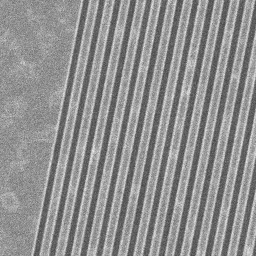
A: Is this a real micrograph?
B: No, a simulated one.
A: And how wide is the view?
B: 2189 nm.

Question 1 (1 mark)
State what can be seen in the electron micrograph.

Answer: parallel lines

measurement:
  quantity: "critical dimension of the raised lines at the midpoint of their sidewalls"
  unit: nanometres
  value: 72.5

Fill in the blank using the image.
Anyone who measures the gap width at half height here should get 57.7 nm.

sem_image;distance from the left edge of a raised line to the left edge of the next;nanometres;131